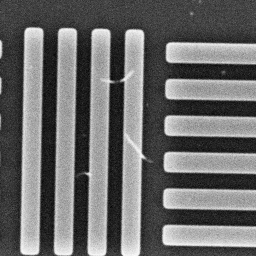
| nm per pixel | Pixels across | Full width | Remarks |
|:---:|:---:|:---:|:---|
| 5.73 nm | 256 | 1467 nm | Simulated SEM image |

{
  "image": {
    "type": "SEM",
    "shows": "groups of lines, slits or small figures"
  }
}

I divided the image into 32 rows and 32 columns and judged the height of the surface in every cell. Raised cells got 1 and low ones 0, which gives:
00000000000000000000000000000000
00000000000000000000000000000000
00000000000000000000000000000000
00000000000000000000000000000000
00011001110011001100000000000000
00011001100011001100011111100000
00011001100011001100011111111111
00011001100111001100011111111111
00011001100111001100000000000000
00011001100111001100000000000000
00011001100111001100011111111111
00011001100111001100011111111111
00011001100111001100000000000000
00011001100111001100000000000000
00011001100111001100000000000000
00011001100111001100011111111111
00011001100111001100011111111111
00011001100110001100000000000000
00011001100110011100000000000000
00011001100110011100011111111111
00011001100110011100011111111111
00011001100110011100000000111111
00011001100110011100000000000000
00011001100110011000000000000000
00011001100110011000111111111111
00011001100110011000111111111111
00011001100110011000000000000000
00011001100110011000000000000000
00011001100110011000011111111111
00011001100110011000111111111111
00011001100110011000011111111111
00011001100110011000000000000000